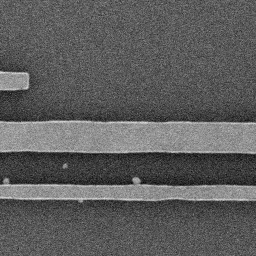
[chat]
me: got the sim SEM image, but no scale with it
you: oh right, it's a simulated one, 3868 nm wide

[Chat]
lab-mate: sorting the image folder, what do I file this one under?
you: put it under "groups of lines, slits or small figures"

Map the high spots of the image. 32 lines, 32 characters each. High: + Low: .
................................
................................
................................
................................
................................
................................
................................
................................
................................
+++.............................
+++.............................
................................
................................
................................
................................
++++++++++++++++++++++++++++++++
++++++++++++++++++++++++++++++++
++++++++++++++++++++++++++++++++
++++++++++++++++++++++++++++++++
................................
................................
................................
................................
++++++++++++++++++++++++++++++++
++++++++++++++++++++++++++++++++
................................
................................
................................
................................
................................
................................
................................